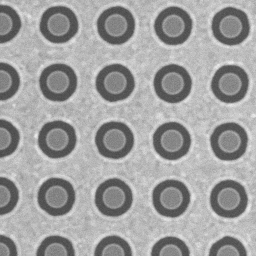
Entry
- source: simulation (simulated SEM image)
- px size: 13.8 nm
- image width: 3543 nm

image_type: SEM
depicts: an array of small figures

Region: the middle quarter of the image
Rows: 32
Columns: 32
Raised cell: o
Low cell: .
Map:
..oooooooo......oooooooo......oo
...oooooo........oooooo........o
...ooooo....oo...ooooo....o.....
o...oooo..ooooo...oooo...oooo...
o...ooo...ooooo...oooo...ooooo..
o...oooo..ooooo...oooo...ooooo..
...ooooo...oooo...oooo...oooo...
...ooooo.........oooooo.........
..ooooooo.......oooooooo.......o
.oooooooooo....oooooooooo.....oo
oooooooooooooooooooooooooooooooo
oooooooooooooooooooooooooooooooo
oooooooooooooooooooooooooooooooo
oooooooooooooooooooooooooooooooo
.ooooooooo.....oooooooooo....ooo
..ooooooo.......ooooooo........o
...ooooo.........ooooo.........o
o..ooooo...oooo...oooo...oooo...
o...ooo...ooooo...oooo...oooo...
o...ooo...ooooo...oooo...oooo...
...ooooo..ooooo...oooo...oooo...
...ooooo.........ooooo....oo...o
..ooooooo.......ooooooo........o
oooooooooo.....ooooooooo......oo
oooooooooooooooooooooooooooooooo
oooooooooooooooooooooooooooooooo
oooooooooooooooooooooooooooooooo
oooooooooooooooooooooooooooooooo
ooooooooooo...oooooooooooooooooo
..ooooooo.......oooooooo......oo
..oooooo.........oooooo........o
...ooooo...ooo...ooooo...ooo....